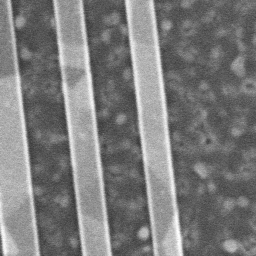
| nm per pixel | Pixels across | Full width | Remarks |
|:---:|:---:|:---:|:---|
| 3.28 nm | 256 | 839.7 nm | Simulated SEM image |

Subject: one or a few lines or trenches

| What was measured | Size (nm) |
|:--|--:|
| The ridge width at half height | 87.6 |